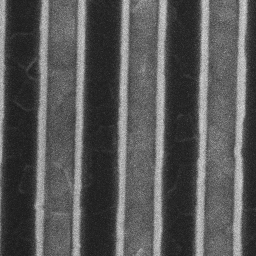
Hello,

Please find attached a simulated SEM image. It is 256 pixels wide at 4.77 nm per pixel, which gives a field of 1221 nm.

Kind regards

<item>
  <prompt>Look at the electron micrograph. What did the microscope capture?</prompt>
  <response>one or a few lines or trenches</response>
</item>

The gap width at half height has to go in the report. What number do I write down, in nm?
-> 165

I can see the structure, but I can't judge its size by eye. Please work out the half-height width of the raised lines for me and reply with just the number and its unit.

217 nm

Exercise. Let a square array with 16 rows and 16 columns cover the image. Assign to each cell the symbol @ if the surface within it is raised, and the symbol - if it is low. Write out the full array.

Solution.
@@@--@@@--@@@--@
@@@--@@@--@@@--@
@@@--@@@--@@@--@
@@@--@@@--@@@--@
@@@--@@@--@@@--@
@@@--@@@--@@@--@
@@@--@@@--@@@--@
@@@--@@@--@@@--@
@@@--@@@--@@@--@
@@@--@@@--@@@--@
@@@--@@@--@@@--@
@@@--@@@--@@@--@
@@@--@@@--@@@--@
@@@--@@@--@@@--@
@@@--@@@--@@@--@
@@---@@@--@@@--@